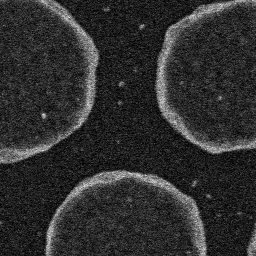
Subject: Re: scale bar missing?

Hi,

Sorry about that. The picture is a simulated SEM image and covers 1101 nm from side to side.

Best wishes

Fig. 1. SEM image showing raised bodies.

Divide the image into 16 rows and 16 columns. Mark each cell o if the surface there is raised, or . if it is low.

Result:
ooo..........ooo
ooooo......ooooo
ooooo......ooooo
oooooo....oooooo
oooooo....oooooo
oooooo....oooooo
oooooo....oooooo
ooooo......ooooo
oooo........oooo
oo..............
................
.....ooooo......
....oooooooo....
...ooooooooo....
...oooooooooo...
...oooooooooo...